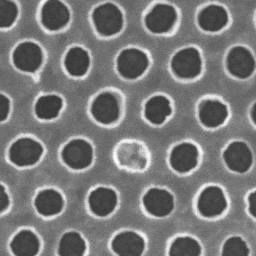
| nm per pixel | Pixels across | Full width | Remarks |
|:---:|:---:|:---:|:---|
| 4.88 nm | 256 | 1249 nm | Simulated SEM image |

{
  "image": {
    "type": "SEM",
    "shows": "a regular array of holes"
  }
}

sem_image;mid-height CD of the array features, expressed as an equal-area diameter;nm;146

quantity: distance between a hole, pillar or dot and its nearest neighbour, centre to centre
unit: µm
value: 0.251